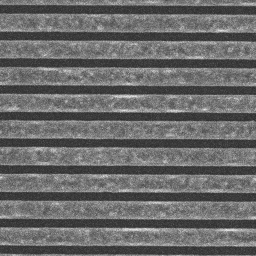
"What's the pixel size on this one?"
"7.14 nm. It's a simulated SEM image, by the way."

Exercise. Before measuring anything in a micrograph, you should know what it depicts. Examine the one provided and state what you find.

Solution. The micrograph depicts parallel lines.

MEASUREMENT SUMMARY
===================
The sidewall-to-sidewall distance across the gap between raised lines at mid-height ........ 67.8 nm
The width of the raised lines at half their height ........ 123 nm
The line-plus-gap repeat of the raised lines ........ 191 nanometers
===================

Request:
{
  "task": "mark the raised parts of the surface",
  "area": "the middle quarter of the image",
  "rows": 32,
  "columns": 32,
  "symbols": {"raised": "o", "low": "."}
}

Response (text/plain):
................................
oooooooooooooooooooooooooooooooo
oooooooooooooooooooooooooooooooo
oooooooooooooooooooooooooooooooo
oooooooooooooooooooooooooooooooo
................................
................................
................................
ooooooooooooooo.oooooooooooooooo
ooooooooooooooo.oooooooooooooooo
oooooooooooooooooooooooooo..oooo
ooooooooooooooooooooooooooo.oooo
................................
................................
oooooo.ooooooooo..oooooooo....oo
oooooooooooooooooooooooooooooooo
oooooooooooooooooooooooooooooooo
oooooooooooooooooooooooooooooooo
....oooooooooooooo.ooo.oooo.ooo.
................................
................................
oooooooooooooooooooooooooooooooo
oooooooooooooooooooooooooooooooo
oooooooooooooooooooooooooooooooo
oooooooooooooooooooooooooooooooo
................................
................................
................................
oooooooooooooooooooooooooooooooo
oooooooooooooooooooooooooooooooo
oooooooooooooooooooooooooooooooo
oooooooooooooooooooooooooooooooo